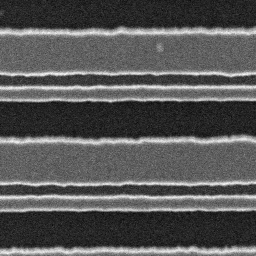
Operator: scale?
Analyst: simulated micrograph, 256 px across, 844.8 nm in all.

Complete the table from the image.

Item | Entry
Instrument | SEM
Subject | lines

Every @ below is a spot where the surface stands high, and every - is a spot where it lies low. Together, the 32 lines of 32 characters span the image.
--------------------------------
--------------------------------
--------------------------------
--------------------------------
@@@@@@@@@@@@@@@@@@@@@@@@@@@@@@@@
@@@@@@@@@@@@@@@@@@@@@@@@@@@@@@@@
@@@@@@@@@@@@@@@@@@@@@@@@@@@@@@@@
@@@@@@@@@@@@@@@@@@@@@@@@@@@@@@@@
@@@@@@@@@@@@@@@@@@@@@@@@@@@@@@@@
@@@@@@@@@@@@@@@@@@@@@@@@@@@@@@@@
@@@@@@@@@@@@@@@@@@@@@@@@@@@@@@@@
@@@@@@@@@@@@@@@@@@@@@@@@@@@@@@@@
@@@@@@@@@@@@@@@@-@@@@@@@@@-@@--@
--------------------------------
--------------------------------
--------------------------------
--------------------------------
----------------------@@----@@@@
@@@@@@@@@@@@@@@@@@@@@@@@@@@@@@@@
@@@@@@@@@@@@@@@@@@@@@@@@@@@@@@@@
@@@@@@@@@@@@@@@@@@@@@@@@@@@@@@@@
@@@@@@@@@@@@@@@@@@@@@@@@@@@@@@@@
@@@@@@@@@@@@@@@@@@@@@@@@@@@@@@@@
@@@@@@@@@@@@@@@@@@@@@@@@@@@@@@@@
@@@@@@@@@@@@@@@@@@@@@@@@@@@@@@@@
@@@@@@@@@@@@@@@@@@@@@@@@@@@@@@@@
--------------------------------
--------------------------------
--------------------------------
--------------------------------
--------------------------------
@@@@@@@@@@@@@@@@@@@@@@@@@@@@@@@@